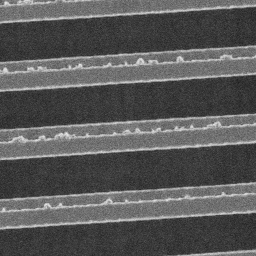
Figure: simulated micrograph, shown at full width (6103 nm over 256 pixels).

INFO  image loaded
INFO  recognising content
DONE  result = lines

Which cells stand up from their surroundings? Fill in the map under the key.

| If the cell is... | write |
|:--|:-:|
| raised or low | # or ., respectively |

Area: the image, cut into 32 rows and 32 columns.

################################
#####################...........
#####...........................
................................
................................
................................
.....................###########
.....###########################
################################
############################....
#############...................
................................
................................
................................
............................####
..............##################
################################
################################
######################..........
######..........................
................................
................................
................................
.......................#########
........########################
################################
################################
################................
##..............................
................................
................................
..............................##